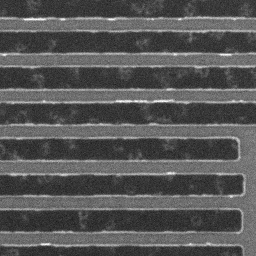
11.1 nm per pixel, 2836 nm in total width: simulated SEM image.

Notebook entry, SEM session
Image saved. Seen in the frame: parallel lines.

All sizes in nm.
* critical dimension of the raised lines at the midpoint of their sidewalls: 267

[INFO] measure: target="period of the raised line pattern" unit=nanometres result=396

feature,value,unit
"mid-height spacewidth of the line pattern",134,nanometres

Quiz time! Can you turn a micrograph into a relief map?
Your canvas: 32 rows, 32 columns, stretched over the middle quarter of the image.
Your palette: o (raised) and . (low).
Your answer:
................................
oooooooooooooooooooooooooooooooo
oooooooooooooooooooooooooooooooo
oooooooooooooooooooooooooooooooo
oooooooooooooooooooooooooooooooo
oooooooooooooooooooooooooooooooo
................................
................................
................................
.ooo..oooooooooooooooooooooooooo
oooooooooooooooooooooooooooooooo
oooooooooooooooooooooooooooooooo
oooooooooooooooooooooooooooooooo
oooooooooooooooooooooooooooooooo
oooooooooooooooooooooooooooooooo
................................
................................
................................
..o.......oo.ooo....oooo.ooo....
oooooooooooooooooooooooooooooooo
oooooooooooooooooooooooooooooooo
oooooooooooooooooooooooooooooooo
oooooooooooooooooooooooooooooooo
oooooooooooooooooooooooooooooooo
................................
................................
................................
.....oooo.........ooooo..oooo..o
oooooooooooooooooooooooooooooooo
oooooooooooooooooooooooooooooooo
oooooooooooooooooooooooooooooooo
oooooooooooooooooooooooooooooooo